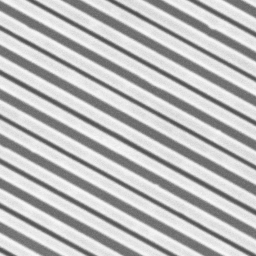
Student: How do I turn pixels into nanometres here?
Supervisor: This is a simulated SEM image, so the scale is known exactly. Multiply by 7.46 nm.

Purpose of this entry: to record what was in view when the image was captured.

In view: parallel lines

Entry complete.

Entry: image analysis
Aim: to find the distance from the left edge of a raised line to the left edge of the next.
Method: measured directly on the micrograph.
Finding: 145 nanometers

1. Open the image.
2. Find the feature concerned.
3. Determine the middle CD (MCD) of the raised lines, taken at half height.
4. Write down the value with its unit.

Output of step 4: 0.0835 micrometres